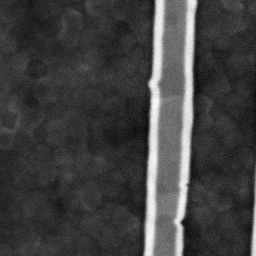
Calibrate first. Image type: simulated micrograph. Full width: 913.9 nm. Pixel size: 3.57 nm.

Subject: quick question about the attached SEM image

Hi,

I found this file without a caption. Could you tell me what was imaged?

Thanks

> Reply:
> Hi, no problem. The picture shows one or a few lines or trenches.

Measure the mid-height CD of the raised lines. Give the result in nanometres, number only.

115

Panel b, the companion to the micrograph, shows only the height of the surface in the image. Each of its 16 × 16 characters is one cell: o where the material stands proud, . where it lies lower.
..........oo....
..........oo....
..........oo....
..........oo....
..........oo....
..........oo....
..........oo....
..........oo....
..........oo....
..........oo....
..........oo....
.........ooo....
.........oo.....
.........oo.....
.........oo.....
.........oo.....